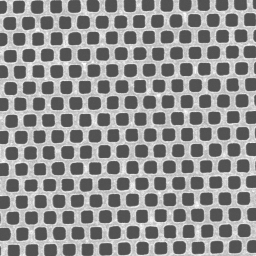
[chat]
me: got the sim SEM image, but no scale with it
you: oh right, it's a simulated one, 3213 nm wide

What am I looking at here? a regular array of holes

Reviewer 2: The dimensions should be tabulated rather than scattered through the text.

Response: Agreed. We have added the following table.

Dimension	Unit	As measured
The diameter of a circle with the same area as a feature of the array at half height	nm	178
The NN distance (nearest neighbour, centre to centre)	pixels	18.3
